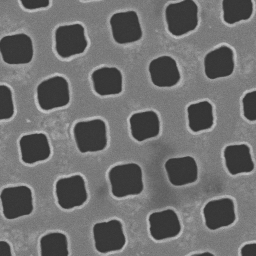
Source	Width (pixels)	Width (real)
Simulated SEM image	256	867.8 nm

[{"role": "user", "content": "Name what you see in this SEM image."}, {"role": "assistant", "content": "a regular array of holes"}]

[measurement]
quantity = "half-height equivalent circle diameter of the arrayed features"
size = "105 nm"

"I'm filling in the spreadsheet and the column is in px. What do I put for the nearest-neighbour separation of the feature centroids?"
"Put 56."